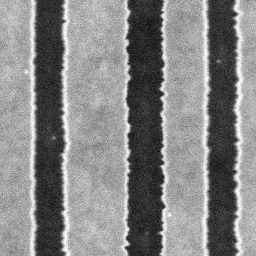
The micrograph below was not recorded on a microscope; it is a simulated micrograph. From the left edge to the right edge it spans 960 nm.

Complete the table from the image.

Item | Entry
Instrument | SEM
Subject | lines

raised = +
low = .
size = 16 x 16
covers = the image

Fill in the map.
++..++++..+++..+
++..++++..+++..+
++..++++..+++..+
++..++++..+++..+
++..++++..+++..+
++..++++..+++..+
++..++++..+++..+
++..++++..+++..+
++..++++..+++..+
++..++++..+++..+
++..++++..+++..+
++..++++..+++..+
++..++++..+++..+
++..++++..+++..+
++..++++..+++..+
++..++++..+++..+